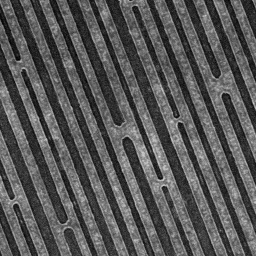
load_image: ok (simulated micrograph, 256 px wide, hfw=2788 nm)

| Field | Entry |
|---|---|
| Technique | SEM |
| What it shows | parallel lines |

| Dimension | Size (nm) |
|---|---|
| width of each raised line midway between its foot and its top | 95.1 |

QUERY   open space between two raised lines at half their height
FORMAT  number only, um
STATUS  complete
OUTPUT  0.0939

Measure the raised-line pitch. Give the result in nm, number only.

196